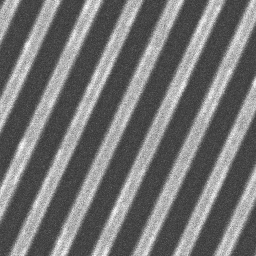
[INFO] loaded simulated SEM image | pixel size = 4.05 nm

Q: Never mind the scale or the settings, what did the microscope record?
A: parallel lines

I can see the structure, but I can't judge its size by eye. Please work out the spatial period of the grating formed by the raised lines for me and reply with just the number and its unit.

151 nm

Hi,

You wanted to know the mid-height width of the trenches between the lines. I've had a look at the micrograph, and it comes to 96.6 nanometres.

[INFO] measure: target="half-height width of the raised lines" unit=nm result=55.6